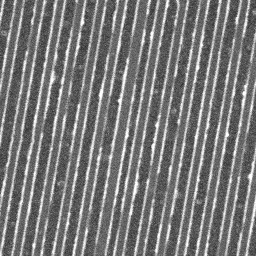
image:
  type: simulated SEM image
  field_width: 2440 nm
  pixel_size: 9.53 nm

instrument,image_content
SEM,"parallel lines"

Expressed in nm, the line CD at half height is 120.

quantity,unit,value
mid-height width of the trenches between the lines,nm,69.2